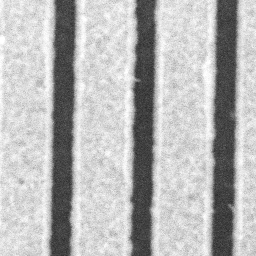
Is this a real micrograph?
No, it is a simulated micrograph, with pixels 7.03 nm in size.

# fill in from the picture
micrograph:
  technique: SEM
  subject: one or a few lines or trenches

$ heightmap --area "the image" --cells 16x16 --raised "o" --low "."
ooo..ooo..ooo..o
ooo..ooo..ooo..o
ooo..ooo..ooo..o
ooo..ooo..ooo..o
ooo..ooo..ooo..o
ooo..ooo..ooo..o
ooo..ooo..ooo..o
ooo..ooo..ooo..o
ooo..ooo..ooo..o
ooo..ooo..ooo..o
ooo..ooo..ooo..o
ooo..ooo..ooo..o
ooo..ooo..ooo..o
ooo..ooo..ooo..o
ooo..ooo..ooo..o
ooo..ooo..ooo..o